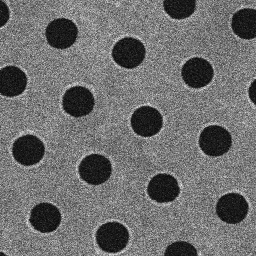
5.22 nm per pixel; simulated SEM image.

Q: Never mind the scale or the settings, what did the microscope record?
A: a regular array of holes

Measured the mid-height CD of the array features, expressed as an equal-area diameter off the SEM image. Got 164 nanometres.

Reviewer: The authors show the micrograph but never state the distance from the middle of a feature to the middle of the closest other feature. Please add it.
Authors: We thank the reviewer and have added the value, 0.363 um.